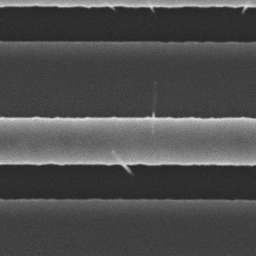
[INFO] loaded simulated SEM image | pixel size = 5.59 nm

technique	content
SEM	lines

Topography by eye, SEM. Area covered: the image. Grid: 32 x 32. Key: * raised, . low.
********************************
................................
................................
................................
................................
********************************
********************************
********************************
********************************
********************************
********************************
********************************
********************************
********************************
********************************
********************************
********************************
********************************
********************************
********************************
....**.*.....*.**.**..****.*****
................................
................................
................................
................................
********************************
********************************
********************************
********************************
********************************
********************************
********************************